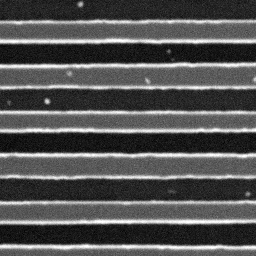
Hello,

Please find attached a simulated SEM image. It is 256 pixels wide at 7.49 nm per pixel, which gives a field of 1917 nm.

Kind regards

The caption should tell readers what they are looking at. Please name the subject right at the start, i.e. lines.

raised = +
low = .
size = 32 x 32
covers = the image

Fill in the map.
................................
................................
................................
++++++++++++++++++++++++++++++++
++++++++++++++++++++++++++++++++
................................
................................
................................
++++++++++++++++++++++++++++++++
++++++++++++++++++++++++++++++++
++++++++++++++++++++++++++++++++
................................
................................
................................
++++++++++++++++++++++++++++++++
++++++++++++++++++++++++++++++++
................................
................................
................................
++++++++++++++++++++++++++++++++
++++++++++++++++++++++++++++++++
++++++++++++++++++++++++++++++++
................................
................................
................................
++++++++++++++++++++++++++++++++
++++++++++++++++++++++++++++++++
++++++++++++++++++++++++++++++++
................................
................................
................................
++++++++++++++++++++++++++++++++